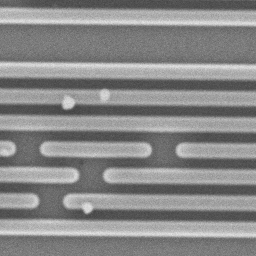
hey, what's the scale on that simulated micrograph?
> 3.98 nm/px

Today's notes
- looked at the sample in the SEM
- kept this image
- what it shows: groups of lines, slits or small figures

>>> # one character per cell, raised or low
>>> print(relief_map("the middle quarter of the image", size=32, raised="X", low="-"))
XXXXXXXXXXXXXXXXXXXXXX----------
XXXXXXXXXXXXXXXXXXXXXXXXXXXXXXXX
XXXXXXXXXXXXXXXXXXXXXXXXXXXXXXXX
-----------------------------XXX
--------------------------------
--------------------------------
----------X---------------------
XXXXXXXXXXXXXXXXXXXXXXXXXXXXXXXX
XXXXXXXXXXXXXXXXXXXXXXXXXXXXXXXX
XXXXXXXXXXXXXXXXXXXXXXXXXXXXXXXX
XX------------------------------
--------------------------------
--------------------------------
XXXXXXXXXXXXXXXXXXXXXXXXXXXXXXXX
XXXXXXXXXXXXXXXXXXXXXXXXXXXXXXXX
XXXXXXXXXXXXXXXXXXXXXXXXXXXXXXXX
---------------------XXXXXXXXXXX
--------------------------------
--------------------------------
--------------------------------
XXXXXXXXXXXXXXXXXXXXX--------XXX
XXXXXXXXXXXXXXXXXXXXX-------XXXX
XXXXXXXXXXXXXXXXXXXXX--------XXX
--------------------------------
--------------------------------
--------------------------------
XXX--------XXXXXXXXXXXXXXXXX----
XXX-------XXXXXXXXXXXXXXXXXXXXXX
XXX-------XXXXXXXXXXXXXXXXXXXXXX
-------------XXXXXXXXXXXXXXXXXXX
--------------------------------
--------------------------------